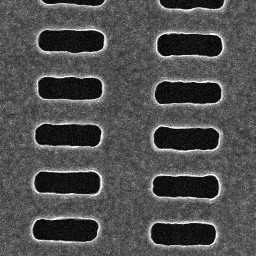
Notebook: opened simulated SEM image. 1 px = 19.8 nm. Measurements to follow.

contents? a regular array of holes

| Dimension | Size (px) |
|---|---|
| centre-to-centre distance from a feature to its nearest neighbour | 47.2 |